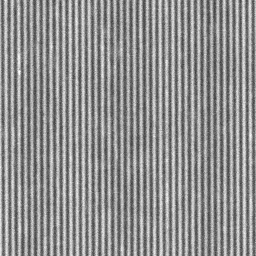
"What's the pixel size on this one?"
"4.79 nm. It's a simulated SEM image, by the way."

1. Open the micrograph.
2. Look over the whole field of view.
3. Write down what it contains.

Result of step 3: parallel lines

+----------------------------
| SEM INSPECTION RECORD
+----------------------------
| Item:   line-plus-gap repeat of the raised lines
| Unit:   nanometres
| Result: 30.8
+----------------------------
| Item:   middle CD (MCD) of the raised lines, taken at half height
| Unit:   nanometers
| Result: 10.2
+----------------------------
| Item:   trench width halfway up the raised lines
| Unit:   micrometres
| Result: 0.0204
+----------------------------